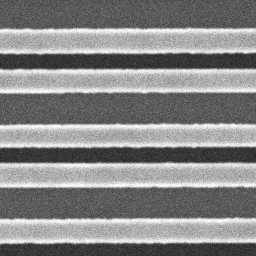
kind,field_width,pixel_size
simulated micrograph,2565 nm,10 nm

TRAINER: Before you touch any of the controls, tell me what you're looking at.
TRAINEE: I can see lines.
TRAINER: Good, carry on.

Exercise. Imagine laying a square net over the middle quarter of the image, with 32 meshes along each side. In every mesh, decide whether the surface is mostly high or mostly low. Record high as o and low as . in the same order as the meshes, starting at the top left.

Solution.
................................
oooooooooooooooooooooooooooooooo
oooooooooooooooooooooooooooooooo
oooooooooooooooooooooooooooooooo
oooooooooooooooooooooooooooooooo
oooooooooooooooooooooooooooooooo
oooooooooooooooooooooooooooooooo
................................
................................
................................
................................
................................
................................
................................
................................
oooooooooooooooooooooooooooooooo
oooooooooooooooooooooooooooooooo
oooooooooooooooooooooooooooooooo
oooooooooooooooooooooooooooooooo
oooooooooooooooooooooooooooooooo
oooooooooooooooooooooooooooooooo
................................
................................
................................
................................
oooooooooooooooooooooooooooooooo
oooooooooooooooooooooooooooooooo
oooooooooooooooooooooooooooooooo
oooooooooooooooooooooooooooooooo
oooooooooooooooooooooooooooooooo
oooooooooooooooooooooo.ooooooooo
................................